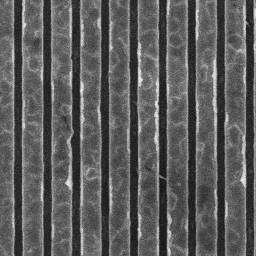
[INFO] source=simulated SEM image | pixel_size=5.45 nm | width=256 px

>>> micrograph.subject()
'parallel lines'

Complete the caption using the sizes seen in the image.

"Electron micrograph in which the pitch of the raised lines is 158 nanometers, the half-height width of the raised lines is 111 nanometres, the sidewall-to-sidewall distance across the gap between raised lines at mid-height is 45.7 nanometres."